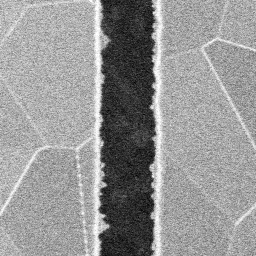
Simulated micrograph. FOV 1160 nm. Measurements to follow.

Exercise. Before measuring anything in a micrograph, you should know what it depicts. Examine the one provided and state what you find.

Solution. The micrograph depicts one or a few lines or trenches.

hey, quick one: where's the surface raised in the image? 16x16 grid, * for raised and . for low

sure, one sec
******....******
******....******
******....******
******....******
******....******
******....******
******....******
******....******
******....******
******....******
******....******
******....******
******....******
******....******
******....******
******....******